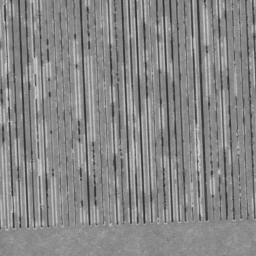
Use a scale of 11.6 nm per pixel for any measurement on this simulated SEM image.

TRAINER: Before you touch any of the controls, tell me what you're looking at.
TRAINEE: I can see parallel lines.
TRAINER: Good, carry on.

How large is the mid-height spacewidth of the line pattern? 21.8 nm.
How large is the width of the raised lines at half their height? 0.0567 um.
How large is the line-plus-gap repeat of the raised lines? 80.2 nm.